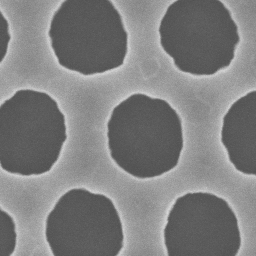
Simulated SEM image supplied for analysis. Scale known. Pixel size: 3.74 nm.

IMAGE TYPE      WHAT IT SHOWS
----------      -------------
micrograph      holes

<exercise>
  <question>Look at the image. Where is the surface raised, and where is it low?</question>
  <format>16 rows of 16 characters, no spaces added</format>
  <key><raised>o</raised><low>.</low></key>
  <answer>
oooo...oooo...oo
ooo.....oo.....o
.oo.....oo.....o
oooo....ooo....o
ooooo.oooooo..oo
oooooooooooooooo
....oooo..ooooo.
....ooo....ooo..
....ooo....ooo..
....ooo....ooo..
...ooooo...oooo.
oooooooooooooooo
oooo...oooo...oo
.oo....oooo....o
.oo.....oo.....o
.oo.....oo.....o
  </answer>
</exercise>